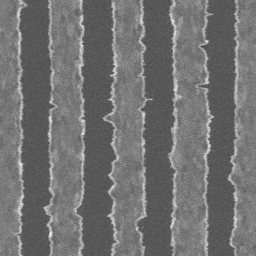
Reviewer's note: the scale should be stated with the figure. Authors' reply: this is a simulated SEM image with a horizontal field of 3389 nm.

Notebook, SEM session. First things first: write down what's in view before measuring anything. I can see one or a few lines or trenches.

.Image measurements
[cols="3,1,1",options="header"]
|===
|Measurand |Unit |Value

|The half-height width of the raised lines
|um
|0.417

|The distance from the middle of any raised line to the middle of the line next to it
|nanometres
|821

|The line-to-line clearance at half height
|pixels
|30.6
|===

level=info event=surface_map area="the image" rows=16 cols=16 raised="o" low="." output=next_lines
o..oo..oo..oo..o
o..oo..oo..oo..o
o..oo..oo..oo..o
o..oo..oo..oo..o
o..oo..oo..oo..o
o..oo..oo..oo..o
o..oo..oo..oo..o
o..oo..oo..oo..o
o..oo..oo..oo..o
o..oo..oo..oo..o
o..oo..oo..oo..o
o..oo..oo..oo..o
o..oo..oo..oo..o
o..oo..oo..oo..o
o..oo..oo..oo..o
o..oo..oo..oo..o